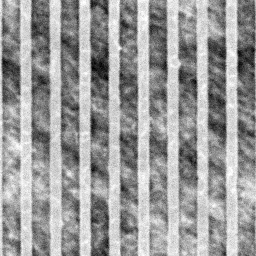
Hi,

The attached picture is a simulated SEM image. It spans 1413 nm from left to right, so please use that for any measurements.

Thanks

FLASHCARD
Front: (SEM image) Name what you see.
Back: parallel lines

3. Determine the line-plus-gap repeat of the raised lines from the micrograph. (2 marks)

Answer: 0.162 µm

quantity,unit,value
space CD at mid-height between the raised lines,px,19.4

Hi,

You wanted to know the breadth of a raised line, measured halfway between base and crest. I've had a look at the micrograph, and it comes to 55.9 nm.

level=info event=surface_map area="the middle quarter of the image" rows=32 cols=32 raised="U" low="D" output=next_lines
DDDDUUUDDDDUUUDDDDDUUDDDDDUUUDDD
DDDDUUUDDDDUUUDDDDDUUDDDDDUUUDDD
DDDDUUUDDDDUUUDDDDDUUDDDDDUUDDDD
DDDDUUUDDDDUUUDDDDDUUDDDDDUUDDDD
DDDDUUUDDDDUUUDDDDDUUDDDDDUUDDDD
DDDDUUUDDDDUUUDDDDDUUDDDDDUUDDDD
DDDDUUUDDDDUUUDDDDDUUDDDDDUUDDDD
DDDDUUDDDDDUUUDDDDDUUDDDDDUUDDDD
DDDDUUDDDDDUUUDDDDDUUDDDDDUUUDDD
DDDDUUDDDDDDUUDDDDDUUDDDDDUUUDDD
DDDDUUDDDDDDUUDDDDDUUDDDDDUUUDDD
DDDDUUDDDDDUUUDDDDDUUDDDDDUUUDDD
DDDDUUDDDDDUUUDDDDDUUDDDDDUUUDDD
DDDDUUDDDDDUUUDDDDDUUDDDDDUUUDDD
DDDDUUDDDDDDUUDDDDDUUDDDDDUUDDDD
DDDDUUDDDDDDUUDDDDDUUDDDDDUUDDDD
DDDDUUDDDDDDUUDDDDDUUDDDDDUUUDDD
DDDDUUDDDDDUUUDDDDDUUDDDDDUUUDDD
DDDDUUDDDDDUUUDDDDDUUDDDDDUUDDDD
DDDDUUDDDDDUUUDDDDDUUDDDDDUUDDDD
DDDDUUDDDDDUUUDDDDDUUDDDDDUUDDDD
DDDDUUDDDDDUUUDDDDDUUDDDDDUUDDDD
DDDDUUDDDDDUUUDDDDDUUDDDDDUUDDDD
DDDDUUDDDDDUUUDDDDDUUDDDDDUUDDDD
DDDDUUDDDDDUUUDDDDDUUDDDDDUUDDDD
DDDDUUDDDDDUUUDDDDDUUDDDDDUUDDDD
DDDDUUDDDDDUUUDDDDDUUDDDDDUUDDDD
DDDDUUDDDDDUUUDDDDDUUDDDDDUUDDDD
DDDDUUDDDDDUUUDDDDDUUDDDDDUUUDDD
DDDDUUDDDDDUUUDDDDDUUDDDDDUUUDDD
DDDDUUDDDDDUUUDDDDDUUDDDDDUUUDDD
DDDDUUDDDDDUUUDDDDDUUDDDDDUUUDDD